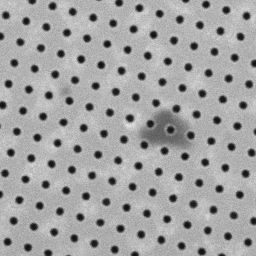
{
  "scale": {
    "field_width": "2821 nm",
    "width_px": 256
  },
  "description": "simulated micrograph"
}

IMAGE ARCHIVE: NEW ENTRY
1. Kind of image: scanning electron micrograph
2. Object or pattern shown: a regular array of holes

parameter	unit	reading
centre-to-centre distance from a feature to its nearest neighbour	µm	0.231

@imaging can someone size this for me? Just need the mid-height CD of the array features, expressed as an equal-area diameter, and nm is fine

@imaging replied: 89.7